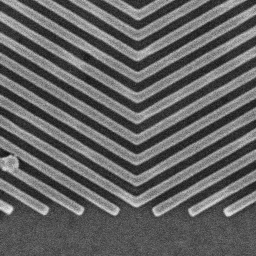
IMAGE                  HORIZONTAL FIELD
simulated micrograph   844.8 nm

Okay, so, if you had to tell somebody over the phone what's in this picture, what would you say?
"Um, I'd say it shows groups of lines, slits or small figures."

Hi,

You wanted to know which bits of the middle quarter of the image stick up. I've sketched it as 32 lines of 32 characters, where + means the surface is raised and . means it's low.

...++++....+++++.....+++++....++
....+++++....++++...++++.....+++
+.....++++.....+++++++.....++++.
+++....+++++....+++++....+++++..
+++++....++++.....+.....++++....
..+++++....++++......+++++....++
....+++++....++++...++++.....+++
+.....++++.....+++++++.....++++.
+++....++++.....+++++....++++...
++++.....++++...........++++....
..++++....+++++.......++++.....+
....++++....+++++...+++++....+++
+....++++.....+++++++++.....++++
++.....++++....++++++.....++++..
++++.....++++....++.....++++....
..++++....+++++.......+++++....+
...+++++....++++.....++++....+++
.....++++....+++++.++++....+++++
++.....++++....++++++.....++++..
++++....++++.....+++....+++++...
.++++.....++++.........++++....+
...++++....+++++.....++++.....++
.....++++....++++..+++++....++++
++....+++++....++++++.....++++..
+++.....++++.....++.....+++++...
.++++....+++++.........++++.....
..+++++....++++......++++.....++
....++++.....++++..++++.....++++
+.....++++....++++++++.....++++.
+++....++++.....++++.....++++...
+++++....++++..........+++++....
..++++....+++++......+++++.....+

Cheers